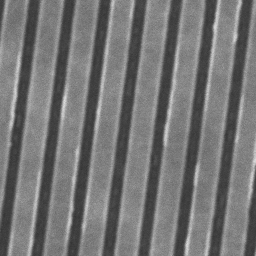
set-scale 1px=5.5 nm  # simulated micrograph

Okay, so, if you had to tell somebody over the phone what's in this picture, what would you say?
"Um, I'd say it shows parallel lines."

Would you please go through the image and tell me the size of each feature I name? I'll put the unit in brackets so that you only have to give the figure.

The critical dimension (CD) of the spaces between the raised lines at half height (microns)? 0.0608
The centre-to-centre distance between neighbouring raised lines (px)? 35.2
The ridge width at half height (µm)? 0.132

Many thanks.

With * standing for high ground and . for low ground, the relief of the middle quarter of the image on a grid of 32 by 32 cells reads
.******...******...******...****
.******..*******...*****...*****
.*****...******...******...*****
.*****...******...******...*****
******...******...******...*****
******...******...******...*****
******...******...******...*****
******...******...******...*****
******...*****....******..******
******..******...******...******
*****....*****...******...******
*****...******...******...******
*****...******...******...******
*****...******...******...******
*****...******...******...******
*****...******...******..******.
*****...******...*****...******.
*****...*****...******...******.
*****..******...******...******.
****...******...******...******.
****...******...******...******.
****...******...******...******.
****...******...******...******.
****...******...******...*****..
****..*******...*****...******..
****..******...******...******..
***...******...******...******..
***...******...******...******..
***...******...******...******..
***...******...******...******..
***...******...******...******..
***...******...******..******...